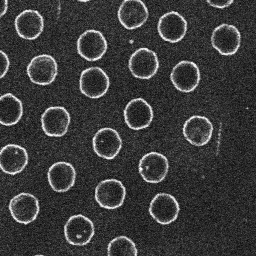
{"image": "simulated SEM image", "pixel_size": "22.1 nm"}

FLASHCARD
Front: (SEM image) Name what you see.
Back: a regular array of raised bodies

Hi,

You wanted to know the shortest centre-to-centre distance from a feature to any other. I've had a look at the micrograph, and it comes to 46.9 pixels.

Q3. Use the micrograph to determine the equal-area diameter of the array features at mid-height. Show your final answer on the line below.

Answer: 637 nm